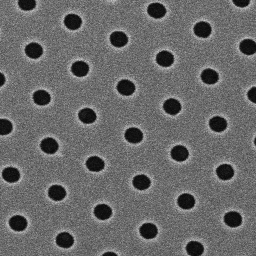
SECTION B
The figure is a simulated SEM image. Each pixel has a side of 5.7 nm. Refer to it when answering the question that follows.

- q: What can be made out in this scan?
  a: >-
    a regular array of holes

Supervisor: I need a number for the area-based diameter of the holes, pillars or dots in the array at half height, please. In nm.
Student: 101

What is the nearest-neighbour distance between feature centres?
272 nanometers